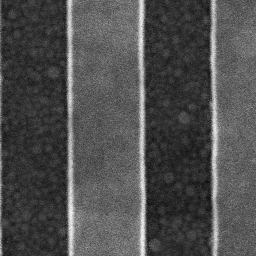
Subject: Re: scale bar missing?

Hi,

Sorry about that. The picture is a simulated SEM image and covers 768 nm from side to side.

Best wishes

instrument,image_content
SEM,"one or a few lines or trenches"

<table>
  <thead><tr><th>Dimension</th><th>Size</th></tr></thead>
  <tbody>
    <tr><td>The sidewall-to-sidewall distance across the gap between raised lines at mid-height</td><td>215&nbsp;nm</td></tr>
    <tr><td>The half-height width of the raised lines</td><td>218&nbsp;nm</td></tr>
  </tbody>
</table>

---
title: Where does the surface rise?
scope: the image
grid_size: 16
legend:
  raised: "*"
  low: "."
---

....*****....***
....*****....***
....*****....***
....*****....***
....*****....***
....*****....***
....*****....***
....*****....***
....*****....***
....*****....***
....*****....***
....*****....***
....*****....***
....*****....***
....*****....***
....*****....***